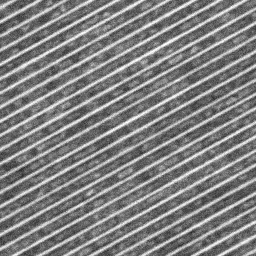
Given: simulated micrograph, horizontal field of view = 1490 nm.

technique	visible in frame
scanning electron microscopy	parallel lines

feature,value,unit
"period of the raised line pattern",72.3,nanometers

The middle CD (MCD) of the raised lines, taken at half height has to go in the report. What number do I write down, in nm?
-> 10.8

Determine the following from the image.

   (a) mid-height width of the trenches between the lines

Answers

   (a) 63.7 nm